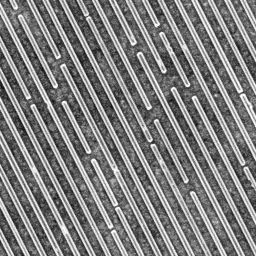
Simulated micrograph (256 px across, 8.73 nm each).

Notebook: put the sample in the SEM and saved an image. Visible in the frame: parallel lines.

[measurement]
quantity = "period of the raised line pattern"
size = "14.7 pixels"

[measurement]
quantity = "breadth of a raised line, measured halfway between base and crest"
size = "38 nm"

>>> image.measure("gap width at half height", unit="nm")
91.5